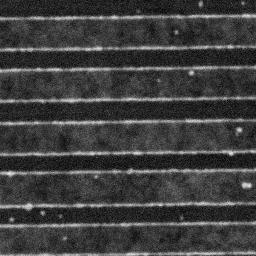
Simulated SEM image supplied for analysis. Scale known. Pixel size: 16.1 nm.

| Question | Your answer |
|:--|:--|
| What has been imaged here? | lines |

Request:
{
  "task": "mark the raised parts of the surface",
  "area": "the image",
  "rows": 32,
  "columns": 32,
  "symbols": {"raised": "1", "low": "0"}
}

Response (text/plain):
00000000000000000000000000000000
00000000000000000000000000000000
11111111111111111111111111111111
11111111111111111111111111111111
11111111111111111111111111111111
11111111111111111111111111111111
00000000000000000000000000000000
00000000000000000000000000000000
00000000000000000000000011111111
11111111111111111111111111111111
11111111111111111111111111111111
11111111111111111111111111111111
11111111111110000000000000000000
00000000000000000000000000000000
00000000000000000000000000000000
11111111111111111111111111111111
11111111111111111111111111111111
11111111111111111111111111111111
11111111111111111111111111111111
00000000000000000000000000000000
00000000000000000000000000000000
01000000011111111111111111111111
11111111111111111111111111111111
11111111111111111111111111111111
11111111111111111111111111111111
11111111111111111111111111111100
00000000000000000000000000000000
00000000000000000000000000000000
11111111111111111111111111111111
11111111111111111111111111111111
11111111111111111111111111111111
11111111111111111111111111111111